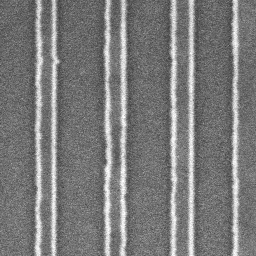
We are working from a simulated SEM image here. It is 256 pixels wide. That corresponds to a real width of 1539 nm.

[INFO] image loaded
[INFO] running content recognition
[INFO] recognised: one or a few lines or trenches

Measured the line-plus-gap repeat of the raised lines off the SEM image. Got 410 nanometers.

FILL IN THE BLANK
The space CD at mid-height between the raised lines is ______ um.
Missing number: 0.302